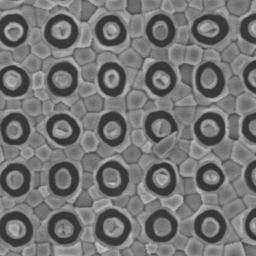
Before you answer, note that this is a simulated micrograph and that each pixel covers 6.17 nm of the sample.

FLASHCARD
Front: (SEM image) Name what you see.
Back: a regular array of ring-shaped grooves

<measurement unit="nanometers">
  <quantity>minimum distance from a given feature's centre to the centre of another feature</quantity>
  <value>297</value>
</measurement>